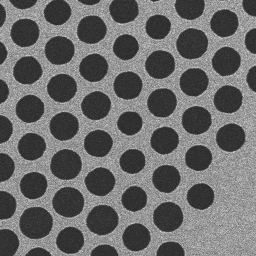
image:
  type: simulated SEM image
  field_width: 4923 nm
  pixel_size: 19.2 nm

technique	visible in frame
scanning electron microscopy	a regular array of holes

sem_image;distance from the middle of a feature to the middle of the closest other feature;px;37.7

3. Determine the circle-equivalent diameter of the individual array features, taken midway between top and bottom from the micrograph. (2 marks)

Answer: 557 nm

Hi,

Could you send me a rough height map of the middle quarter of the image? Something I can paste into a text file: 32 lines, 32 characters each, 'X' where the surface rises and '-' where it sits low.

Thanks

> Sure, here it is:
XXXX-------XXXXXXXXX--------XXXX
XXXX-------XXXXXXXXX--------XXX-
-XXX-------XXX----XXX------XXX--
--XXX-----XXX------XXX---XXXX---
---XXX--XXXX--------XXXXXXXXX---
---XXXXXXXXX--------XXXXXXXXX---
---XXXXXXXXXX------XXXX----XX---
---XXX----XXX------XXX------XX--
--XXX------XXX----XXX-------XXXX
-XXX--------XXXXXXXXX-------XXXX
XXXX--------XXXXXXXXX-------XXXX
XXXX--------XXXXXXXXX-------XX--
--XXX------XXX-----XXX-----XXX--
---XXX----XXXX-----XXXXXXXXXX---
----XXXXXXXXX-------XXXXXXXXX---
----XXXXXXXXX-------XXXXXXXXXX--
----XXXX-XXXXX-----XXXX-----XX--
---XXX-----XXXX---XXXX------XXXX
--XXX-------XXXXXXXXXX-------XXX
XXXXX-------XXXXXXXXX--------XXX
XXXXX-------XXXXXXXXXX------XXXX
--XXX-------XXXX---XXX------XXX-
----XX-----XXXX-----XXXX--XXXX--
----XXXXXXXXXX------XXXXXXXXXX--
----XXXXXXXXXX------XXXXXXXXXX--
-----XXXXXXXXX------XXXX---XXXX-
----XXX----XXXX-----XXX-----XXXX
----XX------XXXXXXXXXX-------XXX
---XX--------XXXXXXXXX-------XXX
XXXXX--------XXXXXXXXX-------XXX
XXXXX--------XXXX-XXXX-------XXX
----XX------XXXX----XXXX----XXX-